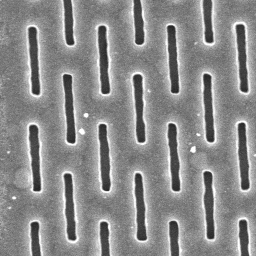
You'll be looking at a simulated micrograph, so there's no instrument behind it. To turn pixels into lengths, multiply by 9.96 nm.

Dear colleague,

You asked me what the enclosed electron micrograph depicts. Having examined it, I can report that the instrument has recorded a regular array of holes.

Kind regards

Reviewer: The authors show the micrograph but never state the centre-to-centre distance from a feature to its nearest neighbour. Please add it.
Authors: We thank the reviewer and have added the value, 592 nm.